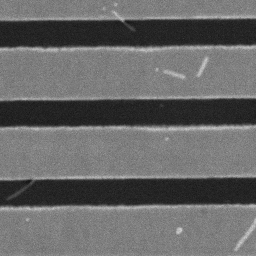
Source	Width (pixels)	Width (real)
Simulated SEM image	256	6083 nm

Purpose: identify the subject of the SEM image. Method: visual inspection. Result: lines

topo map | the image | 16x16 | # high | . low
################
................
................
################
################
################
................
................
################
################
################
................
................
################
################
################